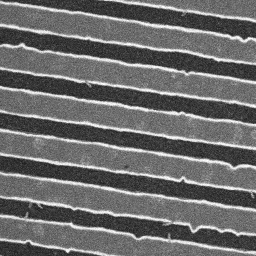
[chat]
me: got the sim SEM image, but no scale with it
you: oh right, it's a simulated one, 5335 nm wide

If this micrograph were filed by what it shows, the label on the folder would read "parallel lines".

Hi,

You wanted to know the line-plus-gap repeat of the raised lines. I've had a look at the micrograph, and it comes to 881 nm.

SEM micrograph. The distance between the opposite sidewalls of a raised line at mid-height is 500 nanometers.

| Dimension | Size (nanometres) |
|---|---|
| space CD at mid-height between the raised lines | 379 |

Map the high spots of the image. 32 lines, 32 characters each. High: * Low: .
**................**************
*********..............*********
***************................*
..********************..........
........********************....
...............*****************
*******.................********
**************..............****
********************............
......*********************.....
.............*******************
****................************
**********.................*****
*****************...............
...*********************........
...........********************.
*................***************
********................********
***************................*
.*********************..........
........********************....
...............*****************
*******...............**********
*************...............****
********************............
......*********************.....
............********************
****................************
**********..............*..*****
*****************...............
....*********************.......
...........*******************..